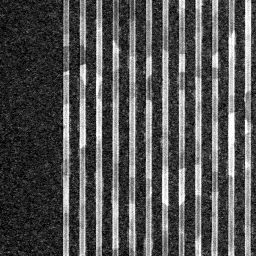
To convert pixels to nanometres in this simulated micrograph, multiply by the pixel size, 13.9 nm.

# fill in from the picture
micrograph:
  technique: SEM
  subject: parallel lines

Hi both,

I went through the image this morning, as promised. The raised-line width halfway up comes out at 67.9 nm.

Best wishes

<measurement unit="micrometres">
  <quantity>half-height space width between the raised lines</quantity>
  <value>0.159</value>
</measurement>